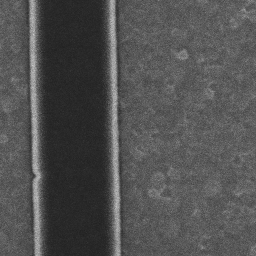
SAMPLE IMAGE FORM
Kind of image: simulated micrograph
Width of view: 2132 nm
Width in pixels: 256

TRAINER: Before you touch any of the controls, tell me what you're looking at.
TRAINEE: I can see one or a few lines or trenches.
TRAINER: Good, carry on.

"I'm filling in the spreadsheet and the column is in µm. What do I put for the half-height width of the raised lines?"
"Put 0.677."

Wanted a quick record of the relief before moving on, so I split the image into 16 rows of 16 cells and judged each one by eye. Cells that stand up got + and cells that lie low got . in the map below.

..+++++.........
..+++++.........
..+++++.........
..+++++.........
..+++++.........
..+++++.........
..+++++.........
..+++++.........
..+++++.........
..+++++.........
..+++++.........
..+++++.........
..+++++.........
..+++++.........
..+++++.........
..+++++.........